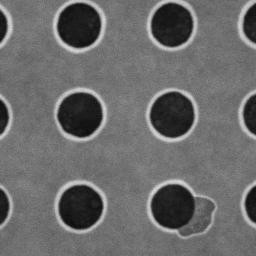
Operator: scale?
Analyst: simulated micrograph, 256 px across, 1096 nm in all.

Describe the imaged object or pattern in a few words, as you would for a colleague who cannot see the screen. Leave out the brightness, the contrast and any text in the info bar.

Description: holes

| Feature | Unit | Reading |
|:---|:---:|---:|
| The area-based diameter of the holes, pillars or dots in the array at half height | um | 0.204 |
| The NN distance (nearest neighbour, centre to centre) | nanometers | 387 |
